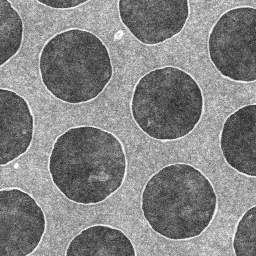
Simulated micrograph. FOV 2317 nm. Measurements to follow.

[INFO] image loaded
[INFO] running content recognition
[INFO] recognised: holes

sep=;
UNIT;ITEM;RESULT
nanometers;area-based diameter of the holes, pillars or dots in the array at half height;665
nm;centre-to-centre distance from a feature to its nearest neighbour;895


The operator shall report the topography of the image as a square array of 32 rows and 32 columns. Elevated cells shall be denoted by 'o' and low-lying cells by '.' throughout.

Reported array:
.oooo.....ooooo........ooooooooo
..ooooooooooooo.........oooo....
...oooooooooooo........oooo.....
...ooooooooooooo.......oooo.....
...oooo.....ooooo.....oooo......
...ooo.......ooooo.ooooooo......
..ooo........ooooooooooooo......
.oooo.........oooooooooooo......
ooooo.........oooooo..ooooo.....
ooooo.........oooo......oooo....
oooooo.......oooo........ooooooo
..oooo.......oooo........ooooooo
...ooooo...oooooo........ooooooo
....oooooooooooo.........ooooo..
....ooooooooooooo........oooo...
....ooooooooooooo........ooo....
....oooo.....ooooo......oooo....
....ooo........ooooooooooooo....
....ooo........ooooooooooooo....
..oooo..........oooooooooooo....
.ooooo..........oooooo.oooooo...
oooooo..........oooo.....ooooo..
ooooooo........oooo.......oooooo
ooooooo........ooo.........ooooo
....oooo......oooo.........ooooo
.....ooooooooooooo.........ooooo
.....ooooooooooooo.........oooo.
......oooooooooooo........oooo..
......ooooo...ooooo.......oooo..
.....ooooo......oooo.....oooo...
.....oooo.......ooooooooooooo...
....oooo.........oooooooooooo...